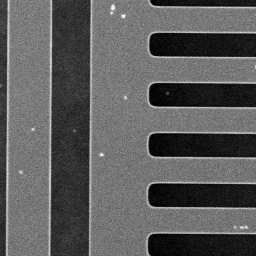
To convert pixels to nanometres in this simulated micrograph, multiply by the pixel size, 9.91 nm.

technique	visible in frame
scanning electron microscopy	groups of lines, slits or small figures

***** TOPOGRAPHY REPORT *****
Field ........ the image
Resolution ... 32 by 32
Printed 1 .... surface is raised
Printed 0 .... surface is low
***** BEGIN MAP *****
01111100000111111110000000000000
01111100000111111111111111111111
01111100000111111111111111111111
01111100000111111111111111111111
01111100000111111110000000000000
01111100000111111110000000000000
01111100000111111110000000000000
01111100000111111111111111111111
01111100000111111111111111111111
01111100000111111111111111111111
01111100000111111110000000000000
01111100000111111110000000000000
01111100000111111110000000000000
01111100000111111111111111111111
01111100000111111111111111111111
01111100000111111111111111111111
01111100000111111111111111111111
01111100000111111110000000000000
01111100000111111110000000000000
01111100000111111110000000000000
01111100000111111111111111111111
01111100000111111111111111111111
01111100000111111111111111111111
01111100000111111110000000000000
01111100000111111100000000000000
01111100000111111110000000000000
01111100000111111111111111111111
01111100000111111111111111111111
01111100000111111111111111111111
01111100000111111110000000000000
01111100000111111100000000000000
01111100000111111110000000000000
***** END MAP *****